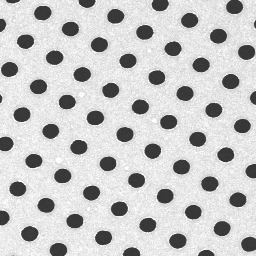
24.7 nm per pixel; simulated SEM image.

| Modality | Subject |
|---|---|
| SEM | a regular array of holes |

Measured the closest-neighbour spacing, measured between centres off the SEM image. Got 801 nanometers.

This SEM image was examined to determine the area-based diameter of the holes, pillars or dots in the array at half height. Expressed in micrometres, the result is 0.398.